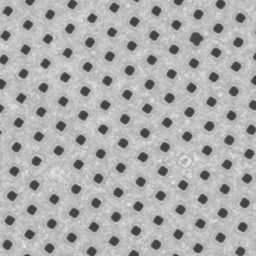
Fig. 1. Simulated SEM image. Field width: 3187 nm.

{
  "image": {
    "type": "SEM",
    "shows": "a regular array of holes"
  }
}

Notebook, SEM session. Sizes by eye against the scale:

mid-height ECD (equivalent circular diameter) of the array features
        128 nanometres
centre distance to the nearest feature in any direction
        301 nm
